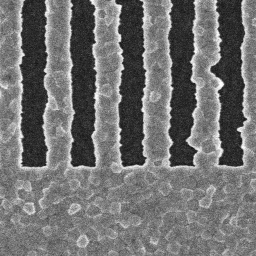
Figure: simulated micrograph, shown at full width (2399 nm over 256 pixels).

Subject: parallel lines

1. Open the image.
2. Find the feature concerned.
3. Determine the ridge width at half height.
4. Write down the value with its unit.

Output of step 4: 240 nanometres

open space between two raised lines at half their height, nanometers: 224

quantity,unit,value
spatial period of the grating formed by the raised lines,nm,461